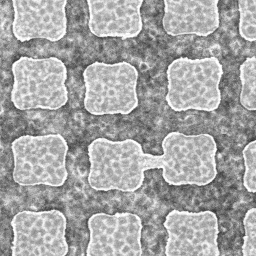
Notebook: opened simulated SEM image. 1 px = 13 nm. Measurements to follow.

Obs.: raised bodies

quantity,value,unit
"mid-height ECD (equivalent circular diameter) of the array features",0.732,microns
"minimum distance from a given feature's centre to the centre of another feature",73.9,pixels